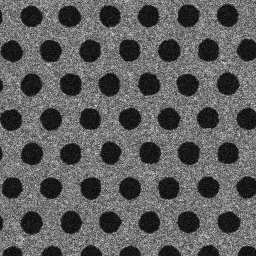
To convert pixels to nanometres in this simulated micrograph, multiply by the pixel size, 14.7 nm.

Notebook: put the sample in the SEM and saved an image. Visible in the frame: a regular array of holes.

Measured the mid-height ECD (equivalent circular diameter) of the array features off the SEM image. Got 0.335 microns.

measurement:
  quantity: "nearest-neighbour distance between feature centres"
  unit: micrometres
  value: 0.572